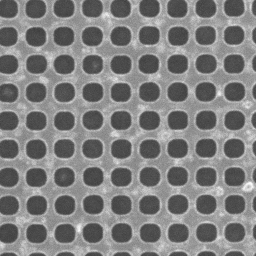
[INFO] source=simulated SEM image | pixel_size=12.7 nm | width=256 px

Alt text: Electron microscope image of a regular array of holes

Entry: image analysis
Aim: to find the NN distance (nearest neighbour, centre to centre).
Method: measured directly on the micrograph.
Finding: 353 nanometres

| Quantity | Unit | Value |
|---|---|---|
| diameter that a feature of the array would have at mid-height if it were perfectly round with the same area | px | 21.5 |